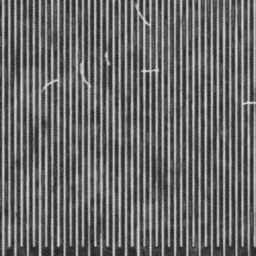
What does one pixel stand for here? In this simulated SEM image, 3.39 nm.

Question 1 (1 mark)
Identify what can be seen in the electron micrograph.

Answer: parallel lines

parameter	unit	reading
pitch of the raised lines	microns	0.0208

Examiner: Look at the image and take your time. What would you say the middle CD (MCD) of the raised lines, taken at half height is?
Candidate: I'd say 5.5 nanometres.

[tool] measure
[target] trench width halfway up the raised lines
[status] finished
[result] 17 nm